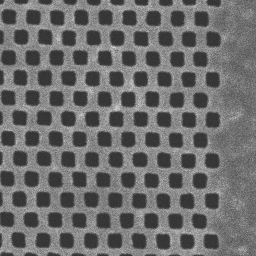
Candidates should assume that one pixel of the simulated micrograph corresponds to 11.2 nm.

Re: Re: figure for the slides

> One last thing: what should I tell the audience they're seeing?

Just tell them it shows a regular array of holes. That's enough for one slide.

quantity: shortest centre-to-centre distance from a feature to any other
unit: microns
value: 0.261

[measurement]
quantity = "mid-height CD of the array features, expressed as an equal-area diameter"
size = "183 nanometres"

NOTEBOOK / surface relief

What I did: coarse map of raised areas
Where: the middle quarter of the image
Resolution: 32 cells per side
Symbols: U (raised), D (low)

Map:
UUUUUUUUUDDDUUUDDUUUUDDDUUUDDDUU
UUUUUUUUUUUUUUUUUUUUUUUUUUUUUUUU
DDDUUDDDDUUDDDDUUUDDDUUDDDDUUUDD
DDDUUDDDDUUDDDDUUDDDDUUDDDDUUDDD
DDDUUDDDDUUDDDDUUDDDDUUDDDDUUUDD
UDUUUUDDUUUUDDUUUUDDDUUUDDDUUUDD
UUUUUUUUUUUUUUUUUUUUUUUUUUUUUUUU
UUDDDDUUDDDDUUDDDDUUDDDDUUUDDDUU
UUDDDDUUDDDDUUDDDDUUDDDDUUDDDDUU
UUDDDDUUDDDDUUDDDDUUDDDDUUDDDDUU
UUUDDUUUUDDDUUUDDDUUUDDUUUUDDDUU
UUUUUUUUUUUUUUUUUUUUUUUUUUUUUUUU
DDDUUDDDDUUUDDDUUDDDDUUDDDDUUDDD
DDDUUDDDDUUDDDDUUDDDDUUDDDDUUDDD
DDDUUDDDDUUDDDDUUDDDDUUDDDDUUDDD
DDUUUUDDDUUUDDDUUUDDDUUUDDDUUUDD
UUUUUUUUUUUUUUUUUUUUUUUUUUUUUUUU
UUDDDUUUDDDDUUDDDDUUDDDDUUUDDUUU
UUDDDDUUDDDDUUDDDDUUDDDDUUDDDDUU
UUDDDDUUDDDDUUDDDDUUDDDDUUDDDDUU
UUUDDUUUUDDDUUUDDDUUUDDDUUDDDDUU
UUUUUUUUUUUUUUUUUUUUUUUUUUUUUUUU
DDDUUDDDDUUDDDUUUDDDUUUUDDUUUUDD
DDDUUDDDDUUDDDDUUDDDDUUDDDDUUDDD
DDDUUDDDDUUDDDDUUDDDDUUDDDDUUDDD
DDDUUUDDDUUUDDDUUDDDUUUUDDDUUDDD
UUUUUUUUUUUUUUUUUUUUUUUUUUUUUUUU
UUDDDDUUDDDUUUDDDDUUDDDUUUDDDUUU
UUDDDDUUDDDDUUDDDDUUDDDDUUDDDDUU
UUDDDDUUDDDDUUDDDDUUDDDDUUDDDDUU
UUDDDDUUDDDDUUUDDDUUDDDDUUDDDDUU
UUUUUUUUUUUUUUUUUUUUUUUUUUUUUUUU